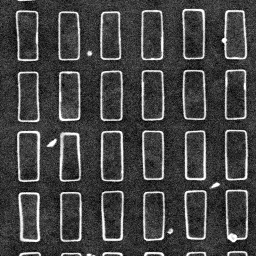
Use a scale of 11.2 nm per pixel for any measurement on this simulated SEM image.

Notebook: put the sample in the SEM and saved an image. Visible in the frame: groups of lines, slits or small figures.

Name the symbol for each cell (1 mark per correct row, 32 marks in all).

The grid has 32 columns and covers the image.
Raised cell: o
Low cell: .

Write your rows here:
................................
..oo..............oo...oo....o..
..ooo..ooo...oo...oo...ooo..ooo.
..ooo..ooo...oo...oo...ooo..ooo.
..ooo..ooo...oo...oo...ooo..ooo.
..ooo..ooo...oo...oo...ooo..ooo.
..ooo..ooo...oo...oo...ooo..ooo.
................................
................................
..ooo...oo...oo...oo...ooo..ooo.
..ooo...oo...oo...oo...ooo..ooo.
..ooo...oo...oo...oo...ooo..ooo.
..ooo...oo...oo...oo...ooo..ooo.
..ooo...oo...oo...oo...ooo..ooo.
..ooo...oo...oo...oo...ooo..ooo.
................................
..................oo....o....o..
..ooo...oo...oo...oo...ooo..ooo.
..ooo...oo...oo...oo...ooo..ooo.
..ooo...oo...oo...oo...ooo..ooo.
..ooo...oo...oo...oo...ooo..ooo.
..ooo...oo...oo...oo...ooo..ooo.
...o....o....oo.................
................................
...oo...oo...oo...oo...ooo..ooo.
...oo...oo...oo...ooo..ooo..ooo.
...oo...oo...oo...ooo..ooo..ooo.
...oo...oo...oo...ooo..ooo..ooo.
...oo...oo...oo...oo...ooo..ooo.
...oo...oo...oo...oo....oo...oo.
................................
................................